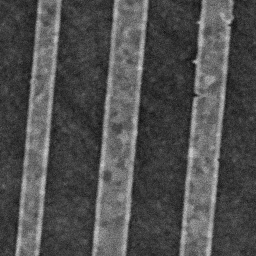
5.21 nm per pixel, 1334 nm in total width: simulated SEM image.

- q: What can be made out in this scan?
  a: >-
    one or a few lines or trenches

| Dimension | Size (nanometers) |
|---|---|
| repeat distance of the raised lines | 435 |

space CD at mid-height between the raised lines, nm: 294